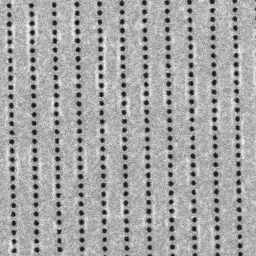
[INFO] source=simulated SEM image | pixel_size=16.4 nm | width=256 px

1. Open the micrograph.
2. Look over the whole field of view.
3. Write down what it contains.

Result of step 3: a regular array of holes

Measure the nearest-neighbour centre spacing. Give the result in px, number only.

8.93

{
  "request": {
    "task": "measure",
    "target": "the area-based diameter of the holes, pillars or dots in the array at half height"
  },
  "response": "90.7 nm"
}